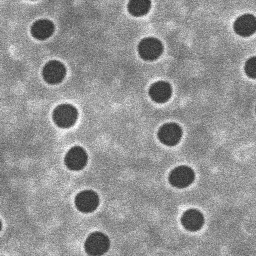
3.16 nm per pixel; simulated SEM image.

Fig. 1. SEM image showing a regular array of holes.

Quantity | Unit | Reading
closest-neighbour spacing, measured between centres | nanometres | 140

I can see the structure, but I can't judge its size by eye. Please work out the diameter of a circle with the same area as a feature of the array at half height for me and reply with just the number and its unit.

80.6 nm